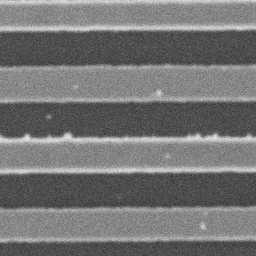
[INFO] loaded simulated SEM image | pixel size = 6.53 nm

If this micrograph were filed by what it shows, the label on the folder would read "lines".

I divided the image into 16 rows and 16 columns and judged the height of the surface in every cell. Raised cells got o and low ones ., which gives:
oooooooooooooooo
oooooooooooooooo
................
................
oooooooooooooooo
oooooooooooooooo
................
................
................
oooooooooooooooo
oooooooooooooooo
................
................
oooooooooooooooo
oooooooooooooooo
................